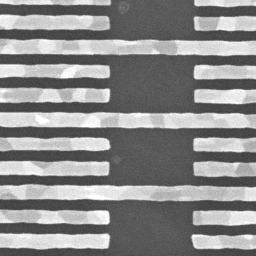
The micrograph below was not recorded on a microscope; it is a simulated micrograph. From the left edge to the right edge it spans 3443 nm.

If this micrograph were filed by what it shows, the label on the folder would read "wiring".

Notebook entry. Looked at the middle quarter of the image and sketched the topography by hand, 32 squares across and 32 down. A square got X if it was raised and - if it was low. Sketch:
XXXXXXXXX-----------------------
XXXXXXXXXXX---------------------
XXXXXXXXXXX---------------------
--------------------------------
--------------------------------
--------------------------------
XXXXXXXX--X---------------------
XXXXXXXXXXX---------------------
XXXXXXXXXXX---------------------
--------------------------------
--------------------------------
--------------------------------
XXXXXXXXXXXXXXX-XXXXXXXXXXXXXXXX
XXXXXXXXXXXXXXXXXXXXXXXXXXXXXXXX
XXXXXXXXXXXXXXXXXXXXXXXXXXXXXXXX
XXXXXXXXXXXXXXXXXXXXXXXXXXXXXXXX
--------------------------------
--------------------------------
--------------------------------
XXXXXXXXXXX---------------------
XXXXXXXXXXX---------------------
--------------------------------
--------------------------------
--------------------------------
XX------------------------------
XXXXXXXXXXX---------------------
XXXXXXXXXXX---------------------
XXXXXXXXXXX---------------------
--------------------------------
--------------------------------
XXX----XXXXX------------------XX
XXXXXXXXXXXXXXXXXXXXXXXXXXXXXXXX